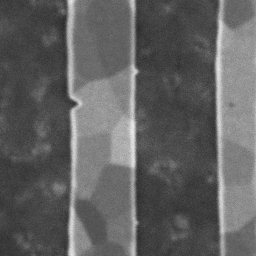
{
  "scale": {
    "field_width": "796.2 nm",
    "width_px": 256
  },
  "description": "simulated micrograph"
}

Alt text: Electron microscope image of one or a few lines or trenches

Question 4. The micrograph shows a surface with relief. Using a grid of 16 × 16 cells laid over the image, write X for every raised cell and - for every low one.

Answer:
----XXXX------XX
----XXXX------XX
----XXXX------XX
----XXXX------XX
----XXXX------XX
----XXXX------XX
-----XXX------XX
-----XXX------XX
-----XXX------XX
-----XXX------XX
-----XXX------XX
-----XXX------XX
-----XXX------XX
----XXXX------XX
----XXXX------XX
----XXXX------XX